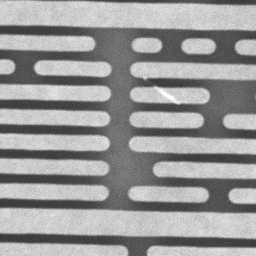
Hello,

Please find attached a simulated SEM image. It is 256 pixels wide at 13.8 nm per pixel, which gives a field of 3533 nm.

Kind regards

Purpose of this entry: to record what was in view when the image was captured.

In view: groups of lines, slits or small figures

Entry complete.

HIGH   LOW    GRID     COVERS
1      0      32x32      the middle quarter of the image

11111111111100000111111111111111
11111111111100000111111111111111
11111111111000000111111111111111
00000000000000000000100000000011
00000000000000000000000000000000
00000000000000000000001000000000
11111111111000000111111111111111
11111111111100000111111111111111
11111111111000000111111111111111
00000000000000000000111111111111
00000000000000000000000000000000
00000000000000000000000000000000
11111111111000000111111111111111
11111111111000000111111111111111
11111111111000000111111111111111
00000000000000000011111111111111
00000000000000000000000000000000
00000000000000000000000000000000
11111111111000000111111111111111
11111111111000000111111111111111
11111111111000000111111111111111
01111111110000000111111111111111
00000000000000000000000000000000
00000000000000000000000000000000
11111111110000000000000000000000
11111111111000000000000111111111
11111111111000000000001111111111
00111111110000000000000111111111
00000000000000000000000000000000
00000000000000000000000000000000
11111111110000000000000000000000
11111111111000001111111111111111